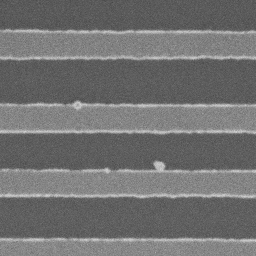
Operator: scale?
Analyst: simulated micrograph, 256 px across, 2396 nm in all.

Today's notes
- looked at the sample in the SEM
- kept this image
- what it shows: lines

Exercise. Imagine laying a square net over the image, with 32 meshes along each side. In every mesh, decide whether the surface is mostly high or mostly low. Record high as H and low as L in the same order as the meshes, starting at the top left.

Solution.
LLLLLLLLLLLLLLLLLLLLLLLLLLLLLLLL
LLLLLLLLLLLLLLLLLLLLLLLLLLLLLLLL
LLLLLLLLLLLLLLLLLLLLLLLLLLLLLLLL
LLLLLLLLLLLLLLLLLLLLLLLLLLLLLLLL
HHHHHHHHHHHHHHHHHHHHHHHHHHHHHHHH
HHHHHHHHHHHHHHHHHHHHHHHHHHHHHHHH
HHHHHHHHHHHHHHHHHHHHHHHHHHHHHHHH
LLLLLLLLLLLLLLLLLLLLLLLLLLLLLLLL
LLLLLLLLLLLLLLLLLLLLLLLLLLLLLLLL
LLLLLLLLLLLLLLLLLLLLLLLLLLLLLLLL
LLLLLLLLLLLLLLLLLLLLLLLLLLLLLLLL
LLLLLLLLLLLLLLLLLLLLLLLLLLLLLLLL
LLLLLLLLLLLLLLLLLLLLLLLLLLLLLLLL
HHHHHHHHHHHHHHHHHHHHHHHHHHHHHHHH
HHHHHHHHHHHHHHHHHHHHHHHHHHHHHHHH
HHHHHHHHHHHHHHHHHHHHHHHHHHHHHHHH
LLLLLLLLLLLLLLLLHLLHHHLLLLLLLLLH
LLLLLLLLLLLLLLLLLLLLLLLLLLLLLLLL
LLLLLLLLLLLLLLLLLLLLLLLLLLLLLLLL
LLLLLLLLLLLLLLLLLLLLLLLLLLLLLLLL
LLLLLLLLLLLLLLLLLLLLLLLLLLLLLLLL
HHHHHHHHHHHHHHHHHHHHHHHHHHHHHHHH
HHHHHHHHHHHHHHHHHHHHHHHHHHHHHHHH
HHHHHHHHHHHHHHHHHHHHHHHHHHHHHHHH
LLLLLLLLHHHHHLLLLHHLLHHLLLLLLHHH
LLLLLLLLLLLLLLLLLLLLLLLLLLLLLLLL
LLLLLLLLLLLLLLLLLLLLLLLLLLLLLLLL
LLLLLLLLLLLLLLLLLLLLLLLLLLLLLLLL
LLLLLLLLLLLLLLLLLLLLLLLLLLLLLLLL
LLLLLLLLLLLLLLLLLLLLLLLLLLLLLLLL
HHHHHHHHHHHHHHHHHHHHHHHHHHHHHHHH
HHHHHHHHHHHHHHHHHHHHHHHHHHHHHHHH